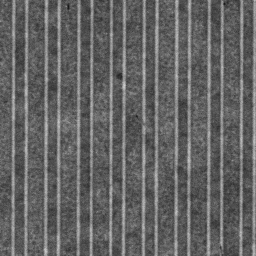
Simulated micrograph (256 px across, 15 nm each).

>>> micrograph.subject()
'parallel lines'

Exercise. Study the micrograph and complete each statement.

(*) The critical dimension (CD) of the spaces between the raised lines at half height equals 296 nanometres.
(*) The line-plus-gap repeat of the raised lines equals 489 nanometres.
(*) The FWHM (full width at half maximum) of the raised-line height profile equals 13.1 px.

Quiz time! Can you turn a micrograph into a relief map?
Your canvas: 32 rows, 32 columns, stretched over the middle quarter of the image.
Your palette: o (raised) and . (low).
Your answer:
....ooo.....ooo.....ooo.....ooo.
....ooo.....ooo.....ooo.....ooo.
....ooo.....ooo.....ooo.....ooo.
....ooo.....ooo.....ooo.....ooo.
....ooo.....ooo.....ooo.....ooo.
....ooo.....ooo.....ooo.....ooo.
....ooo.....ooo.....ooo.....ooo.
....ooo.....ooo.....ooo.....ooo.
....ooo.....ooo.....ooo.....ooo.
....ooo.....ooo.....ooo.....ooo.
....ooo.....ooo.....ooo.....ooo.
....ooo.....ooo.....ooo.....ooo.
....ooo.....ooo.....ooo.....ooo.
....ooo.....ooo.....ooo.....ooo.
....ooo.....ooo....oooo.....ooo.
....ooo.....ooo.....ooo.....ooo.
....ooo.....ooo.....ooo.....ooo.
....ooo.....ooo.....ooo.....ooo.
....ooo.....ooo.....ooo.....ooo.
....ooo.....ooo.....ooo.....ooo.
....ooo.....ooo.....ooo.....ooo.
....ooo.....ooo.....ooo.....ooo.
....ooo.....ooo.....ooo.....ooo.
....ooo.....ooo.....ooo.....ooo.
....ooo.....ooo.....ooo.....ooo.
....ooo.....ooo.....ooo.....ooo.
....ooo.....ooo.....ooo.....ooo.
....ooo.....ooo.....ooo.....ooo.
....ooo.....ooo.....ooo.....ooo.
....ooo.....ooo.....ooo.....ooo.
....ooo.....ooo.....ooo.....ooo.
....ooo.....ooo.....ooo.....ooo.